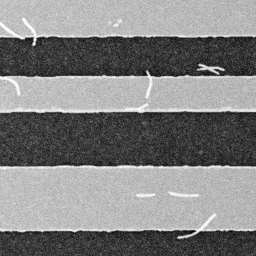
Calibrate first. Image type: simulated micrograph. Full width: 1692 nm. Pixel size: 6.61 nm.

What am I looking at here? lines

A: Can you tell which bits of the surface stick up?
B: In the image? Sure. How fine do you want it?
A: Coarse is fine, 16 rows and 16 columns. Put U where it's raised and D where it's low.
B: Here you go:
UUUUUUUUUUUUUUUU
UUUUUUUUUUUUUUUU
DDDDDDDDDDDDDDDD
DDDDDDDDDDDDDDDD
DDDDDDDDDDDDDDDD
UUUUUUUUUUUUUUUU
UUUUUUUUUUUUUUUU
DDDDDDDDDDDDDDDD
DDDDDDDDDDDDDDDD
DDDDDDDDDDDDDDDD
UUUUUUUUUUUUUUUU
UUUUUUUUUUUUUUUU
UUUUUUUUUUUUUUUU
UUUUUUUUUUUUUUUU
DDDDDDDDDDDDDDDD
DDDDDDDDDDDDDDDD